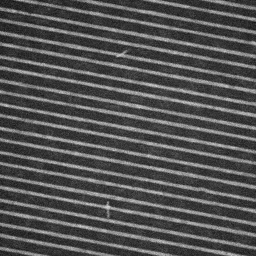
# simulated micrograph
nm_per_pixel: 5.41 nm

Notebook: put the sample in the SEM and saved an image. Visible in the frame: parallel lines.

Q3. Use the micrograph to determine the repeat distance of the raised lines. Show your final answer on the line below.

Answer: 63.7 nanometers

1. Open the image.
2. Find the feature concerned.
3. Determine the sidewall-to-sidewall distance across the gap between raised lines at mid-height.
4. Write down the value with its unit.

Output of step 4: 48.6 nanometres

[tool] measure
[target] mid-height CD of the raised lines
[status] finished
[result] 12 nanometres